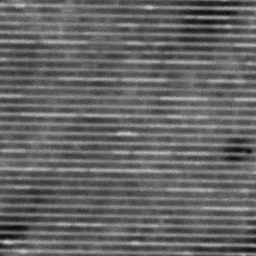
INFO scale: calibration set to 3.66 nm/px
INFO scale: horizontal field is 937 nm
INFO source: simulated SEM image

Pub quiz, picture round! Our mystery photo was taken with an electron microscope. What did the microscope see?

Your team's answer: parallel lines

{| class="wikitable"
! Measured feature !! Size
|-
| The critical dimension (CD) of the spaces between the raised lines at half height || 25.6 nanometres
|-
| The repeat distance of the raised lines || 9.1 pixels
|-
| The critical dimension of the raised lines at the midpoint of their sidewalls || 6.4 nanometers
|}